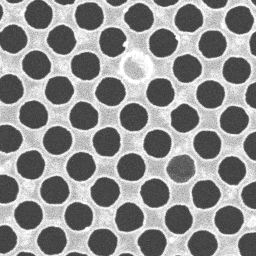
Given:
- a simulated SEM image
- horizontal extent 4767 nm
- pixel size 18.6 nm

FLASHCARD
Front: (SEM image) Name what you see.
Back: a regular array of holes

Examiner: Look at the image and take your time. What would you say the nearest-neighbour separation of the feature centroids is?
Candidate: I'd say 0.648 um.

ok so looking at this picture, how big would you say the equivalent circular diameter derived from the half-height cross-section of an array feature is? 0.548 um